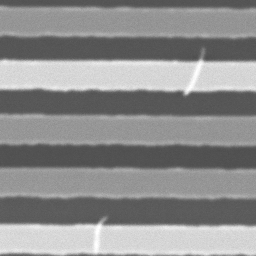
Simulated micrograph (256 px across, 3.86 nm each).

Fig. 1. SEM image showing lines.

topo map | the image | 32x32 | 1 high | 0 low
00000000000000000000000000000000
11111111111111111111111111111111
11111111111111111111111111111111
11111111111111111111111111111111
00000000000001000000010111111110
00000000000000000000000000000000
00000000000000000000000000000000
00000000000000000000000000000000
11111111111111111111111111111111
11111111111111111111111111111111
11111111111111111111111111111111
00000000000000000000000100000000
00000000000000000000000000000000
00000000000000000000000000000000
11111100000000000000000000000000
11111111111111111111111111111111
11111111111111111111111111111111
11111111111111111111111111111111
00000000000000000000000000000000
00000000000000000000000000000000
00000000000000000000000000000000
11111111111111111111111111111111
11111111111111111111111111111111
11111111111111111111111111111111
10001111110111111111111111111111
00000000000000000000000000000000
00000000000000000000000000000000
00000000000000000000000000000000
11111111111111111111111111111111
11111111111111111111111111111111
11111111111111111111111111111111
11111111111111111111111111111111